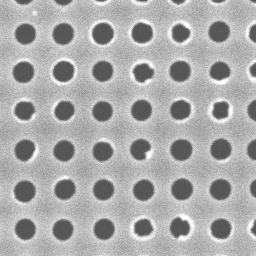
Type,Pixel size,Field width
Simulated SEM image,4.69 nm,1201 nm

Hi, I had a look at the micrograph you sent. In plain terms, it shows a regular array of holes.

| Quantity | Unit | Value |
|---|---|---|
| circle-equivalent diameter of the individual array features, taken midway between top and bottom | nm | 100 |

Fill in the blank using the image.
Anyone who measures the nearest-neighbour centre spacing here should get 179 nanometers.